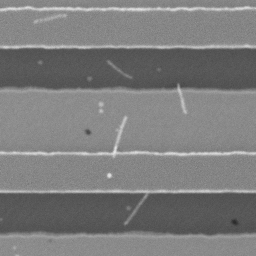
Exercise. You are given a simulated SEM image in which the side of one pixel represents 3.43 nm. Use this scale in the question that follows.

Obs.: lines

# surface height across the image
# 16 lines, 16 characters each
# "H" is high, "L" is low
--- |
HHHHHHHHHHHHHHHH
HHHHHHHHHHHHHHHH
HHHHHHHHHHHHHHHH
LLLLLLLLLLLLLLLL
LLLLLLLLLLLLLLLL
LLLLLLLLLLLLLLLL
HHHHHHHHHHHHHHHH
HHHHHHHHHHHHHHHH
HHHHHHHHHHHHHHHH
HHHHHHHHHHHHHHHH
HHHHHHHHHHHHHHHH
HHHHHHHHHHHHHHHH
LLLLLLLLLLLLLLLL
LLLLLLLLLLLLLLLL
LLLLLLLLLLLLLLLL
HHHHHHHHHHHHHHHH